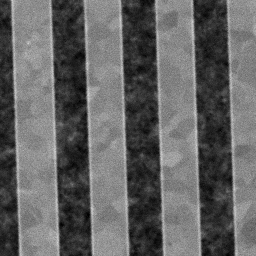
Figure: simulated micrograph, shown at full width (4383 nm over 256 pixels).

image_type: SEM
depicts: one or a few lines or trenches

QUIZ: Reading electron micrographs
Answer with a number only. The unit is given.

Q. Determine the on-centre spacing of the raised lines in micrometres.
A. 1.22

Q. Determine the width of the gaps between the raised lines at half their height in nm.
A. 608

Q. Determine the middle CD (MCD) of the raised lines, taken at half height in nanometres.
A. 622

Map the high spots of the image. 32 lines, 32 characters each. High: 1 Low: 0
00111100000111100001111100000111
00111100000111100001111100000111
00111100000111100000111100000111
00111100000111100000111100000111
00111100000111100000111100000111
00111100000111100000111100000111
00111100000111100000111100000111
00111110000111100000111100000111
00111110000111100000111100000111
00111110000111100000111100000111
00111110000111100000111100000111
00111110000111100000111100000111
00111110000111100000111100000111
00111110000111100000111100000111
00111110000111100000111100000111
00111110000111100000111100000111
00111110000111110000111110000111
00111110000111110000111110000111
00111110000111110000111110000111
00111110000111110000111110000111
00111110000111110000111110000111
00111110000111110000111110000111
00111110000111110000111110000111
00111110000111110000111110000111
00111110000111110000111110000111
00111110000111110000111110000111
00111110000111110000111110000111
00111110000011110000111110000111
00111110000011110000111110000111
00111110000011110000111110000111
00011110000011110000011110000011
00011110000011110000011110000011